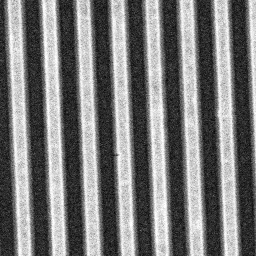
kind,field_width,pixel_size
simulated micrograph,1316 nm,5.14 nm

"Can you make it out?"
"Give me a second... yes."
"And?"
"parallel lines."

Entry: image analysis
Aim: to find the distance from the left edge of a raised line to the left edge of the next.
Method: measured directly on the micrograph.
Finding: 34.4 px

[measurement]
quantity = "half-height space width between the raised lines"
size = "19.4 pixels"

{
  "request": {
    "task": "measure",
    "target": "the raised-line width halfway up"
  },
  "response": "75.8 nm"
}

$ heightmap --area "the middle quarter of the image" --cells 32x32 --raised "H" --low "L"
LLLLHHHLLLLLHHHHLLLLLHHHLLLLLHHH
LLLLHHHLLLLLHHHHLLLLLHHHLLLLLHHH
LLLLHHHLLLLLHHHHLLLLLHHHLLLLLLHH
LLLLHHHLLLLLLHHHLLLLLHHHLLLLLLHH
LLLLHHHLLLLLLHHHLLLLLHHHHLLLLLHH
LLLLHHHHLLLLLHHHLLLLLHHHHLLLLLHH
LLLLHHHHLLLLLHHHLLLLLHHHHLLLLLHH
LLLLHHHLLLLLLHHHLLLLLHHHHLLLLLHH
LLLLHHHHLLLLLHHHLLLLLHHHHLLLLLHH
LLLLHHHHLLLLLHHHLLLLLHHHHLLLLLHH
LLLLHHHHLLLLLHHHLLLLLHHHHLLLLLHH
LLLLHHHHLLLLLHHHLLLLLHHHHLLLLLHH
LLLLHHHHLLLLLHHHLLLLLHHHHLLLLLHH
LLLLHHHHLLLLLHHHLLLLLHHHHLLLLLHH
LLLLHHHHLLLLLHHHLLLLLHHHHLLLLLHH
LLLLHHHHLLLLLHHHLLLLLLHHHLLLLLHH
LLLLHHHHLLLLLHHHHLLLLLHHHLLLLLHH
LLLLHHHHLLLLLHHHHLLLLLHHHLLLLLHH
LLLLHHHHLLLLLHHHHLLLLLHHHLLLLLHH
LLLLHHHHLLLLLHHHHLLLLLHHHLLLLLHH
LLLLHHHHLLLLLHHHHLLLLLHHHLLLLLHH
LLLLHHHHLLLLLHHHHLLLLLHHHLLLLLHH
LLLLLHHHLLLLLLHHHLLLLLHHHLLLLLHH
LLLLLHHHLLLLLHHHHLLLLLHHHLLLLLHH
LLLLLHHHLLLLLHHHHLLLLLHHHLLLLLLH
LLLLLHHHLLLLLHHHHLLLLLHHHLLLLLLH
LLLLLHHHLLLLLHHHHLLLLLHHHLLLLLLH
LLLLLHHHLLLLLHHHHLLLLLHHHLLLLLLH
LLLLLHHHLLLLLLHHHLLLLLHHHHLLLLLH
LLLLLHHHHLLLLLHHHLLLLLHHHHLLLLLH
LLLLLHHHHLLLLLHHHLLLLLHHHHLLLLLH
LLLLLHHHHLLLLLHHHLLLLLHHHHLLLLLH